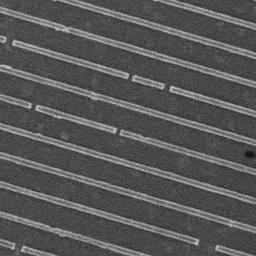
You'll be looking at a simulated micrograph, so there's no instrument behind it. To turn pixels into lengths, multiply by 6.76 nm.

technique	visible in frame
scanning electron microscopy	parallel lines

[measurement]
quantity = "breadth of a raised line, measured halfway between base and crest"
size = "30.8 nanometres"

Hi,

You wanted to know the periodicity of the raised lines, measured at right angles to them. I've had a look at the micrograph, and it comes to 28 px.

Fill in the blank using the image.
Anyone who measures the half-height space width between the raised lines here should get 152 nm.